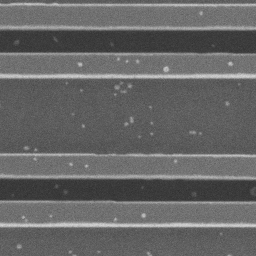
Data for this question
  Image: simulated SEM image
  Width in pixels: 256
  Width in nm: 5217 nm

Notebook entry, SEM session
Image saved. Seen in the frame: lines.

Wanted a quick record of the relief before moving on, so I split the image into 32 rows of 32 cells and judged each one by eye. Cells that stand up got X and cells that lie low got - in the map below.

-XXXXXX-------------------------
XXXXXXXXXXXXXXXXXXXXXXXXXXXXXXXX
XXXXXXXXXXXXXXXXXXXXXXXXXXXXXXXX
XXXXXXXXXXXXXXXXXXXXXXXXXXXXXXXX
--------------------------------
--------------------------------
--------------------------------
XXXXXXXXXXXXXXXXXXXXXXXXXXXXXXXX
XXXXXXXXXXXXXXXXXXXXXXXXXXXXXXXX
XXXXXXXXXXXXXXXXXXXXXXXXXXXXXXXX
--------------------------------
--------------------------------
--------------------------------
--------------------------------
--------------------------------
--------------------------------
--------------------------------
--------------------------------
--------------------------------
XXXXXXXXXXXXXXXXXXXXXXXXXXXXXXXX
XXXXXXXXXXXXXXXXXXXXXXXXXXXXXXXX
XXXXXXXXXXXXXXXXXXXXXXXXXXXXXXXX
--------------------------------
--------------------------------
--------------------------------
XXXXXXXXXXXXXXXXXXXXXXXXXXXXXXXX
XXXXXXXXXXXXXXXXXXXXXXXXXXXXXXXX
XXXXXXXXXXXXXXXXXXXXXXXXXXXXXXXX
--------------------------------
--------------------------------
--------------------------------
--------------------------------